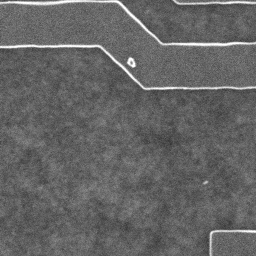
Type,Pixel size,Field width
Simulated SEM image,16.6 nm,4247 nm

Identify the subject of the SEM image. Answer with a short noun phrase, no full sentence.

groups of lines, slits or small figures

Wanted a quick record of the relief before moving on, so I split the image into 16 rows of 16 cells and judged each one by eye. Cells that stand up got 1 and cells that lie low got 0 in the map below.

1111111100000000
1111111110000000
1111111111000000
0000000111111111
0000000011111111
0000000001111111
0000000000000000
0000000000000000
0000000000000000
0000000000000000
0000000000000000
0000000000000000
0000000000000000
0000000000000000
0000000000000011
0000000000000111